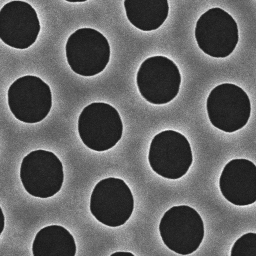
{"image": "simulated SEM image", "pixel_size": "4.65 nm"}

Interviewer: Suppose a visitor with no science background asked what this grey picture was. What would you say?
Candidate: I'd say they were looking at a regular array of holes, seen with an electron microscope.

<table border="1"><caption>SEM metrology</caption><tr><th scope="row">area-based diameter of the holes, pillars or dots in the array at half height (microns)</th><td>0.216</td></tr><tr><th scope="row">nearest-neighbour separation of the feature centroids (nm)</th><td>348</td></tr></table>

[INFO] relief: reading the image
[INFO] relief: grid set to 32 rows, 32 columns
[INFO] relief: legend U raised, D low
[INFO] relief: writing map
UDDDUUUUUUUUUUUUDDDDDUUUUUUUUUUU
DDDDUUUUUUUUUUUUDDDDDUUUUUDDUUUU
DDDDDUUUUUUUUUUUDDDDDUUUUDDDDUUU
DDDDDUUUUUDUUUUUUDDDUUUUDDDDDDUU
DDDDDUUUUDDDDUUUUUUUUUUUDDDDDDUU
UDDDUUUUDDDDDDUUUUUUUUUUUDDDDDUU
UUUUUUUUDDDDDDUUUUUUUUUUUUDDDUUU
UUUUUUUUDDDDDDUUUUDDDUUUUUUUUUUU
UUUUUUUUUDDDDUUUUDDDDDUUUUUUUUUU
UUUDUUUUUUDUUUUUUDDDDDDUUUUUUUUU
UUDDDDUUUUUUUUUUUDDDDDDUUUUUDUUU
UDDDDDUUUUUUUUUUUDDDDDUUUUDDDDDU
UDDDDDUUUUUUUUUUUUDDDUUUUUDDDDDU
UDDDDDUUUUUDDDUUUUUUUUUUUUDDDDDU
UUDDDDUUUUDDDDDUUUUUUUUUUUDDDDDU
UUUUUUUUUUDDDDDUUUUUUUUUUUUDDDDU
UUUUUUUUUUDDDDDUUUUUDDUUUUUUDUUU
UUUUUUUUUUDDDDDUUUUDDDDUUUUUUUUU
UUUUUUUUUUUDDDUUUUUDDDDDUUUUUUUU
UUUDDDDUUUUUUUUUUUUDDDDDUUUUUUUU
UUUDDDDDUUUUUUUUUUUDDDDDUUUUDDDD
UUDDDDDDUUUUUUUUUUUDDDDUUUUUDDDD
UUUDDDDDUUUUUDDUUUUUUUUUUUUDDDDD
UUUDDDDDUUUUDDDDUUUUUUUUUUUUDDDD
UUUUDDUUUUUDDDDDDUUUUUUUUUUUDDDD
UUUUUUUUUUUDDDDDDUUUUUUUUUUUUDDU
UUUUUUUUUUUDDDDDUUUUUDDDDUUUUUUU
DUUUUUUUUUUUDDDDUUUUDDDDDUUUUUUU
UUUUUDDDUUUUUUUUUUUUDDDDDUUUUUUU
UUUUDDDDDUUUUUUUUUUUDDDDDUUUUUDD
UUUUDDDDDUUUUUUUUUUUUDDDDUUUUDDD
UUUUDDDDDUUUUUUDUUUUUUDDUUUUUDDD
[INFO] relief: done